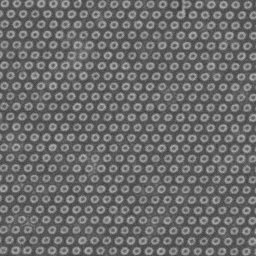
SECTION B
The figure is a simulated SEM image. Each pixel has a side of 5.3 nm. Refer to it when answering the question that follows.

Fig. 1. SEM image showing a regular array of raised bodies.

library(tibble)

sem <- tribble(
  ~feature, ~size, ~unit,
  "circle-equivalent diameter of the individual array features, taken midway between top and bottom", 35.4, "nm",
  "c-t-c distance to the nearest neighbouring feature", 61.6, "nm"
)